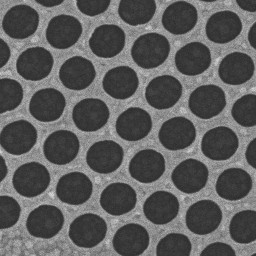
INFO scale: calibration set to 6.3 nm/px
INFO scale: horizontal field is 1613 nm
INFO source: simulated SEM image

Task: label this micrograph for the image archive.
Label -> a regular array of holes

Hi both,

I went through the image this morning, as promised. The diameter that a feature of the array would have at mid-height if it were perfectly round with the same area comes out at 0.222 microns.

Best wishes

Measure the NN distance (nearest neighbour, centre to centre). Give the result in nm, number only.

273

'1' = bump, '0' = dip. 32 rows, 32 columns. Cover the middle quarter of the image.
00000001111111011110000011110000
00000000111100000111111111111000
00000000110000000011111111111100
00000000110000000011110000001111
00000001110000000001100000000111
00000011110000000001100000000111
11101111110000000011000000000011
11111111111000000111000000000111
11111101111110001111000000000110
11110000001111111111100000001110
11100000000111111111110000011110
11000000000111100000111111111111
11000000000111000000011111111111
11000000000110000000001111100011
11100000000110000000001110000000
11100000001110000000001100000000
01110000011110000000001100000000
00011111111110000000011100000000
00011111111111000000111100000000
00001111000001111111111100000000
00001110000000111111111110000001
00001100000000011110001111000111
00011100000000011100000011111111
00011100000000011000000001111111
00111100000000110000000001111000
11111100000000110000000001110000
11111110000001110000000001100000
10000111110111110000000001100000
00000011111111111000000011100000
00000001111111111110001111100000
00000001111000000111111111110000
00000001110000000111111111111000